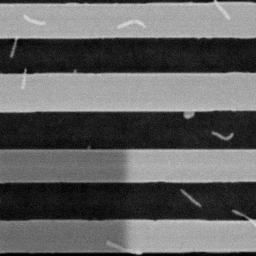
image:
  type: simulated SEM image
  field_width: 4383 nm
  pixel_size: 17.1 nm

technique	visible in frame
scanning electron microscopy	lines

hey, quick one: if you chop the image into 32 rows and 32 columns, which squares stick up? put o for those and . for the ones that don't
........ooo.......oooooooooooooo
oooooooooooooooooooooooooooooooo
oooooooooooooooooooooooooooooooo
oooooooooooooooooooooooooooooooo
oooooooooooooooooooooooooooooooo
................................
................................
................................
................................
oooooooooooooooooooooooooooooooo
oooooooooooooooooooooooooooooooo
oooooooooooooooooooooooooooooooo
oooooooooooooooooooooooooooooooo
oooooooooooooooooooooooooooooooo
................................
................................
................................
................................
................................
oooooooooooooooooooooooooooooooo
oooooooooooooooooooooooooooooooo
oooooooooooooooooooooooooooooooo
oooooooooooooooooooooooooooooooo
................................
................................
................................
................................
...............................o
oooooooooooooooooooooooooooooooo
oooooooooooooooooooooooooooooooo
oooooooooooooooooooooooooooooooo
oooooooooooooooooooooooo..ooo...